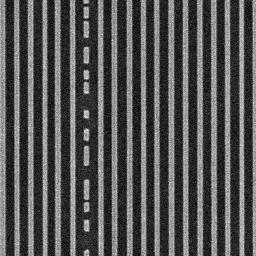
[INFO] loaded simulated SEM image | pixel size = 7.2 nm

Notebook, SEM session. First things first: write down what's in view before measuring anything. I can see parallel lines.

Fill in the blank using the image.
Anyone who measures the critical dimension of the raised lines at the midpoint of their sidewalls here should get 27.9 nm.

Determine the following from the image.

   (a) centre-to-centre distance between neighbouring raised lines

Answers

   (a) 101 nm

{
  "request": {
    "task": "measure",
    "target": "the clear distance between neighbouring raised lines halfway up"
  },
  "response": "0.0693 µm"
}